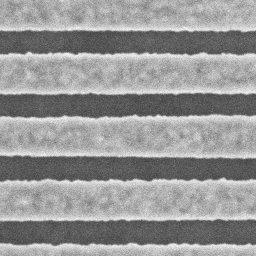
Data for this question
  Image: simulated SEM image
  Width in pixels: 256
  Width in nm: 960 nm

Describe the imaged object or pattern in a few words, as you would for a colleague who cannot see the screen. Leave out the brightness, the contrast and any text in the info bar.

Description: lines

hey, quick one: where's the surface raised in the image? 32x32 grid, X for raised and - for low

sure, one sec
XXXXXXXXXXXXXXXXXXXXXXXXXXXXXXXX
XXXXXXXXXXXXXXXXXXXXXXXXXXXXXXXX
XXXXXXXXXXXXXXXXXXXXXXXXXXXXXXXX
XXXXXXXXXXXXXXXXXXXXXXXXXXXXXXXX
--------------------------------
--------------------------------
--------------------------------
XXXXXXXXXXXXXXXXXXXXXXXXXXXXXXXX
XXXXXXXXXXXXXXXXXXXXXXXXXXXXXXXX
XXXXXXXXXXXXXXXXXXXXXXXXXXXXXXXX
XXXXXXXXXXXXXXXXXXXXXXXXXXXXXXXX
XXXXXXXXXXXXXXXXXXXXXXXXXXXXXXXX
--------------------------------
--------------------------------
----------------X---------XX-X--
XXXXXXXXXXXXXXXXXXXXXXXXXXXXXXXX
XXXXXXXXXXXXXXXXXXXXXXXXXXXXXXXX
XXXXXXXXXXXXXXXXXXXXXXXXXXXXXXXX
XXXXXXXXXXXXXXXXXXXXXXXXXXXXXXXX
----X---------X--XXXXXXXXXXXXXXX
--------------------------------
--------------------------------
------X------------XXX----XX---X
XXXXXXXXXXXXXXXXXXXXXXXXXXXXXXXX
XXXXXXXXXXXXXXXXXXXXXXXXXXXXXXXX
XXXXXXXXXXXXXXXXXXXXXXXXXXXXXXXX
XXXXXXXXXXXXXXXXXXXXXXXXXXXXXXXX
XXXXXXXXXXXXXXX-X-XXX-X---------
--------------------------------
--------------------------------
--------------------------------
XXXXXXXXXXXXXXXXXXXXXXXXXXXXXXXX